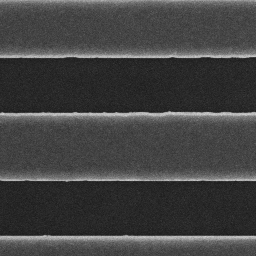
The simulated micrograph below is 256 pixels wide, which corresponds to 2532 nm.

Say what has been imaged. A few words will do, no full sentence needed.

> lines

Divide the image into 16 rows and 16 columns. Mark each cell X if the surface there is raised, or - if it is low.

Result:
XXXXXXXXXXXXXXXX
XXXXXXXXXXXXXXXX
XXXXXXXXXXXXXXXX
XXXXXXXXXXXXXXXX
----------------
----------------
----------------
XXXXXXXXXXXXXXXX
XXXXXXXXXXXXXXXX
XXXXXXXXXXXXXXXX
XXXXXXXXXXXXXXXX
----------------
----------------
----------------
----------------
XXXXXXXXXXXXXXXX